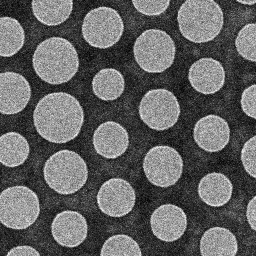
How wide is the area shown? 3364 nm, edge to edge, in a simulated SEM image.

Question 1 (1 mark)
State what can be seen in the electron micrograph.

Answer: a regular array of raised bodies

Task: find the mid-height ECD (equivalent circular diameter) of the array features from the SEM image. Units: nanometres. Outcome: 491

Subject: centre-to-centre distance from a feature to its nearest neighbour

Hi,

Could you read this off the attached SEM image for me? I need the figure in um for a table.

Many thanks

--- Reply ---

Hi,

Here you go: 0.739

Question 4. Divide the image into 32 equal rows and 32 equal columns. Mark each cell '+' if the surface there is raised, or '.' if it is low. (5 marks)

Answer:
....+++++........++++..++++.....
....+++++..+++....++..++++++....
++...+++...++++.......++++++....
+++.......+++++........+++++..++
+++.......+++++...+++..++++...++
+++..++++..+++...+++++........++
++..+++++........+++++........++
....++++++.......+++++...++....+
....++++++........+++...++++....
+++..++++...+++.........++++....
++++........+++.........++++....
++++........+++....++....++....+
++++.++++.........++++........++
+++..+++++.......+++++........++
....++++++........++++....+....+
....++++++...++...++++...+++....
.....+++++..++++........+++++...
+++...+++...++++........+++++..+
++++........++++...++....+++..++
+++....+++...++...++++........++
++....+++++.......+++++.......++
......+++++.......+++++........+
......+++++...+....+++...++++...
.++....+++...+++.........++++...
++++........+++++........++++...
+++++.......+++++.........++...+
+++++...+....+++...++++........+
++++...++++........++++........+
..+....++++........++++.........
.......++++...++....++...++++...
........++...++++.......++++++..
.++++........+++++.......++++...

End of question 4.